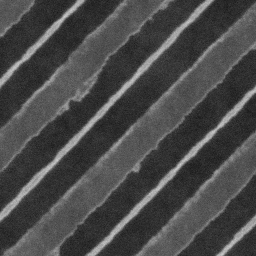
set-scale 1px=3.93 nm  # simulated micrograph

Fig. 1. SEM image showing lines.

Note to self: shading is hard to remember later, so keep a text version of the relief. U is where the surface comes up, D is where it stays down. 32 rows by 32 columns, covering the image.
UUUUDDDDDDDDDDDUUUUUDDDDDDDDDDDD
UUUDDDDDDDDDDDUUUUUDDDDDDDDDDDDU
UUDDDDDDDDDDDUUUUUDDDDDDDDDDDDUU
UDDDDDDDDDDDDUUUUUDDDDDDDDDDDUUU
DDDDDDDDDDDUUUUUDDDDDDDDDDDDUUUU
DDDDDDDDDDDUUUUDDDDDDDDDDDDUUUUU
DDDDDDDDDDUUUUDDDDDDDDDDDDUUUUUD
DDDDDDDDDUUUUDDDDDDDDDDDDUUUUUDD
DDDDDDDDUUUUUDDDDDDDDDDDUUUUUDDD
DDDDDDDUUUUUDDDDDDDDDDDUUUUUDDDD
DDDDDDUUUUUUDDDDDDDDDDUUUUUDDDDD
DDDDDUUUUUUDDDDDDDDDDUUUUUDDDDDD
DDDDUUUUUDDDDDDDDDDDUUUUUDDDDDDD
DDDUUUUUDDDDDDDDDDDUUUUUDDDDDDDD
DDUUUUUDDDDDUDDDDDUUUUUDDDDDDDDD
DUUUUUDDDDDDDDDDDUUUUUDDDDDDDDDD
UUUUUDDDDDDDDDDDUUUUUDDDDDDDDDDD
UUUUDDDDDUDDDDDUUUUUDDDDDDDDDDDU
UUUDDDDDUDDDDDUUUUUDDDDDDDDDDDUU
UUDDDDDDDDDDDUUUUUDDDDDDDDDDDUUU
UDDDDDDDDDDDUUUUUDDDDDDDDDDDUUUU
DDDDDUDDDDDUUUUUDDDDDDDDDDDUUUUU
DDDDUDDDDDUUUUUDDDDDDDDDDDUUUUUD
DDDUDDDDDUUUUUUDDDDDDDDDDUUUUUDD
DDDDDDDDUUUUUUDDDDDDDDDDDUUUUDDD
DUDDDDDUUUUUUDDDDDDDDDDUUUUUDDDD
UDDDDDUUUUUDDDDDDDDDDDDUUUUUDDDD
DDDDDUUUUUUDDDDDDDDDDDUUUUUDDDDD
DDDDUUUUUUDDDDDDDDDDDUUUUUDDDDDD
DDDUUUUUUDDDDDDDDDDDUUUUDDDDDDDD
DDUUUUUUDDDDDDDDDDDUUUUUDDDDDDDD
DUUUUUUDDDDDDDDDDDUUUUUDDDDDDDDD